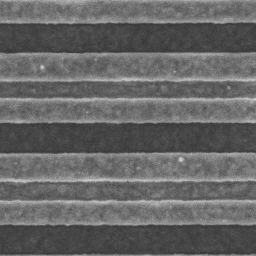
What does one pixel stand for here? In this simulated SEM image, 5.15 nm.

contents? lines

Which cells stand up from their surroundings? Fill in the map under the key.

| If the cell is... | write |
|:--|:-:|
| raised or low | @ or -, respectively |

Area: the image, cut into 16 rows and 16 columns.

@@@@@@@@@@@@@@@@
----------------
----------------
@@@@@@@@@@@@@@@@
@@@@@@@@@@@@@@@@
@@@@@@@@@@@@@@@@
@@@@@@@@@@@@@@@@
@@@@@@@@@@@@@@@@
----------------
----------------
@@@@@@@@@@@@@@@@
@@@@@@@@@@@@@@@@
@@@@@@@@@@@@@@@@
@@@@@@@@@@@@@@@@
----------------
----------------